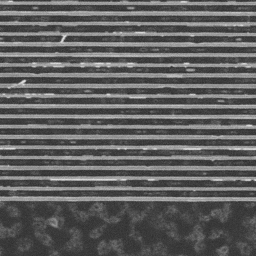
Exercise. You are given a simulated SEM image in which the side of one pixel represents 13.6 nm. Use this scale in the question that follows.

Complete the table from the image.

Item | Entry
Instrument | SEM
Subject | parallel lines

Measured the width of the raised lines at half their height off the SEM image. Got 0.0408 microns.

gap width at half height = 91.9 nanometres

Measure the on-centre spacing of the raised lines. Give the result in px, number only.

10.3